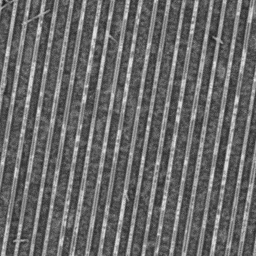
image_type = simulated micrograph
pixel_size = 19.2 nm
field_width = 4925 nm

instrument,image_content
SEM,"parallel lines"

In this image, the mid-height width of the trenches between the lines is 192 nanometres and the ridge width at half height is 0.0522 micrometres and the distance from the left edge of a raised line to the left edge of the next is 0.266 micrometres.